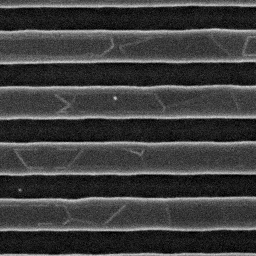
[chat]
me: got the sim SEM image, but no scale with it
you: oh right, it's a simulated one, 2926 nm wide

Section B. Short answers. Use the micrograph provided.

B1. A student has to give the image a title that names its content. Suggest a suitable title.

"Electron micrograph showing wiring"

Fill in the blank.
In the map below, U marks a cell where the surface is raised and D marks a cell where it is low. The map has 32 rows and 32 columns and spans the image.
UUUUUUUUUUUUUUUUUUUUUUUUUUUUUUUU
DDDDDDDDDDDDDDDDDDDDDDDDDDDDDDDD
DDDDDDDDDDDDDDDDDDDDDDDDDDDDDDDD
DDDDDDDDDDDDDDDDDDDDDDDDDDDDDDDD
UUUUUUUUUUUUUUUUUUUUUUUUUUUUUUUU
UUUUUUUUUUUUUUUUUUUUUUUUUUUUUUUU
UUUUUUUUUUUUUUUUUUUUUUUUUUUUUUUU
UUUUUUUUUUUUUUUUUUUUUUUUUUUUUUUU
DDDDDDDDDDDDDDDDDDDDDDDDDDDDDDDD
DDDDDDDDDDDDDDDDDDDDDDDDDDDDDDDD
DDDDDDDDDDDDDDDDDDDDDDDDDDDDDDDD
UUUUUUUUUUUUUUUUUUUUUUUUUUUUUUUU
UUUUUUUUUUUUUUUUUUUUUUUUUUUUUUUU
UUUUUUUUUUUUUUUUUUUUUUUUUUUUUUUU
UUUUUUUUUUUUUUUUUUUUUUUUUUUUUUUU
DDDDDDDDDDDDDDDDDDDDDDDDDDDDDDDD
DDDDDDDDDDDDDDDDDDDDDDDDDDDDDDDD
DDDDDDDDDDDDDDDDDDDDDDDDDDDDDDDD
UUUUUUUUUUUUUUUUUUUUUUUUUUUUUUUU
UUUUUUUUUUUUUUUUUUUUUUUUUUUUUUUU
UUUUUUUUUUUUUUUUUUUUUUUUUUUUUUUU
UUUUUUUUUUUUUUUUUUUUUUUUUUUUUUUU
DDDDDDDDDDDDDDDDDDDDDDDDDDDDDDDD
DDDDDDDDDDDDDDDDDDDDDDDDDDDDDDDD
DDDDDDDDDDDDDDDDDDDDDDDDDDDDDDDD
UUUUUUUUUUUUUUUUUUUUUUUUUUUUUUUU
UUUUUUUUUUUUUUUUUUUUUUUUUUUUUUUU
UUUUUUUUUUUUUUUUUUUUUUUUUUUUUUUU
UUUUUUUUUUUUUUUUUUUUUUUUUUUUUUUU
DDDDDDDDDDDDDDDDDDDDDDDDDDDDDDDD
DDDDDDDDDDDDDDDDDDDDDDDDDDDDDDDD
DDDDDDDDDDDDDDDDDDDDDDDDDDDDDDDD